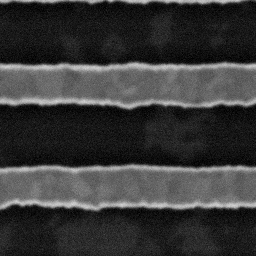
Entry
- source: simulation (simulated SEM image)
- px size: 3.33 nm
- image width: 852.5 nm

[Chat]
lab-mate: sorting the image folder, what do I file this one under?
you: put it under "lines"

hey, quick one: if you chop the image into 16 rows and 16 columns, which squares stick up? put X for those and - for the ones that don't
----------------
----------------
----------------
----------------
XXXXXXXXXXXXXXXX
XXXXXXXXXXXXXXXX
X-----XXXXXXXXXX
----------------
----------------
----------------
-XXX-XXXXXXX-XXX
XXXXXXXXXXXXXXXX
XXXXXXXXXXXXXXXX
----------------
----------------
----------------